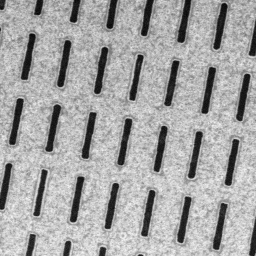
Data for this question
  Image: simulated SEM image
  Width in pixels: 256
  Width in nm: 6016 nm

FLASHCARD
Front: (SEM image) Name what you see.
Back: a regular array of holes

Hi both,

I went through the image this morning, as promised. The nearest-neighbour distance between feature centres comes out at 855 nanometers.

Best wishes